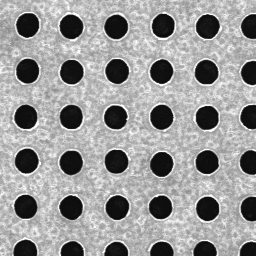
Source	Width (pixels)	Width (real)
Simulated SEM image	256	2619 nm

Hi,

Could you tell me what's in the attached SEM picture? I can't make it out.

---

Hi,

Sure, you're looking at a regular array of holes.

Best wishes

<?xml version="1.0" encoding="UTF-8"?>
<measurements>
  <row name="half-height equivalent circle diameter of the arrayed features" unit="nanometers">243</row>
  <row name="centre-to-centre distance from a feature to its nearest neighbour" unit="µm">0.454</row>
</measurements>